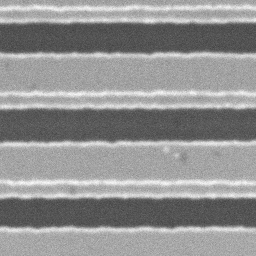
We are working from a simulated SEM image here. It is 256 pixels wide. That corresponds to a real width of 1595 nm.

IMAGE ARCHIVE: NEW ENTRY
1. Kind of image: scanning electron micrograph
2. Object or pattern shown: lines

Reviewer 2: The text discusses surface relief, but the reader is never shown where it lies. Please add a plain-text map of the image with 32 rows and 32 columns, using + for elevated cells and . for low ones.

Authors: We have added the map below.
++++++++++++++++++++++++++++++++
++++++++++++++++++++++++++++++++
++++++++++++++++++++++++++++++++
................................
................................
................................
................................
++++++++++++++++++++++++++++++++
++++++++++++++++++++++++++++++++
++++++++++++++++++++++++++++++++
++++++++++++++++++++++++++++++++
++++++++++++++++++++++++++++++++
++++++++++++++++++++++++++++++++
................................
................................
................................
................................
................................
++++++++++++++++++++++++++++++++
++++++++++++++++++++++++++++++++
++++++++++++++++++++++++++++++++
++++++++++++++++++++++++++++++++
++++++++++++++++++++++++++++++++
++++++++++++++++++++++++++++++++
++++++++++++++++++++++++++++++++
................................
................................
................................
..........................+.....
++++++++++++++++++++++++++++++++
++++++++++++++++++++++++++++++++
++++++++++++++++++++++++++++++++